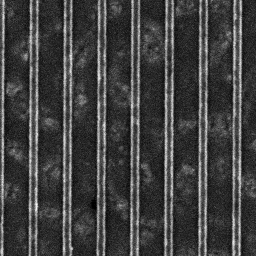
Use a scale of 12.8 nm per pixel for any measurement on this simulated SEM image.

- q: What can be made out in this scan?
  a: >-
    parallel lines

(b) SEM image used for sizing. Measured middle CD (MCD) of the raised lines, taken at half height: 91.2 nm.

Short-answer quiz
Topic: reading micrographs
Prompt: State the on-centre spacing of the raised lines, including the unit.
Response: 434 nanometres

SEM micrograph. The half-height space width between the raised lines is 0.344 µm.